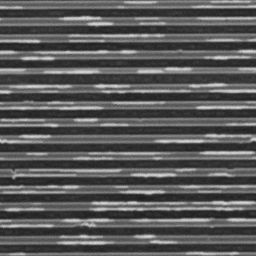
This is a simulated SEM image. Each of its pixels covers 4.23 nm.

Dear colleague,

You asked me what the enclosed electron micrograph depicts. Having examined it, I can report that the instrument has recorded parallel lines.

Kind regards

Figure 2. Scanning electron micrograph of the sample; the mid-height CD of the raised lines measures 32.8 nanometers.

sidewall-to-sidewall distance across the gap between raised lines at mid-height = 39.7 nanometers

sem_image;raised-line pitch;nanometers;71.1